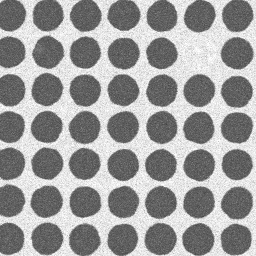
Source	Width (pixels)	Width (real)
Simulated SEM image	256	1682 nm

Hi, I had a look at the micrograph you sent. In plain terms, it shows a regular array of holes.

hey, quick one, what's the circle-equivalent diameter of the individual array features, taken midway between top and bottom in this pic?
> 209 nm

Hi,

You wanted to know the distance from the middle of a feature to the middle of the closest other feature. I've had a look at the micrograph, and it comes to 244 nm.